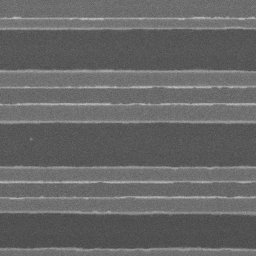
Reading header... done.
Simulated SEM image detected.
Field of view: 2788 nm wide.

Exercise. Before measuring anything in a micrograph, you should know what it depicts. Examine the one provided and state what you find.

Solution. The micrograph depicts lines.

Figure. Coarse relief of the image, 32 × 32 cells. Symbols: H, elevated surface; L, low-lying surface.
HHHHHHHHHHHHHHHHHHHHHHHHHHHHHHHH
HHHHHHHHHHHHHHHHHHHHHHHHHHHHHHHH
HHHHHHHHHHHHHHHHHHHHHHHHHHHHHHHH
HHHHHHHHHHHHHHHHHHHHHHHHHHHHHLHH
LLLLLLLLLLLLLLLLLLLLLLLLLLLLLLLL
LLLLLLLLLLLLLLLLLLLLLLLLLLLLLLLL
LLLLLLLLLLLLLLLLLLLLLLLLLLLLLLLL
LLLLLLLLLLLLLLLLLLLLLLLLLLLLLLLL
LLLLLLLLLLLLLLLLLLLLLLLLLLLLLLLL
HHHHHHHHHHHHHHHHHHHHHHHHHHHHHHHH
HHHHHHHHHHHHHHHHHHHHHHHHHHHHHHHH
HHHHHHHHHHHHHHHHHHHHHHHHHHHHHHHH
HHHHHHHHHHHHHHHHHHHHHHHHHHHHHHHH
HHHHHHHHHHHHHHHHHHHHHHHHHHHHHHHH
HHHHHHHHHHHHHHHHHHHHHHHHHHHHHHHH
LLLLLLLLLLLLLLLLLLLLLLLLLLLLLLLL
LLLLLLLLLLLLLLLLLLLLLLLLLLLLLLLL
LLLLLLLLLLLLLLLLLLLLLLLLLLLLLLLL
LLLLLLLLLLLLLLLLLLLLLLLLLLLLLLLL
LLLLLLLLLLLLLLLLLLLLLLLLLLLLLLLL
LLLLLLLLLLLLLLLLLLLLLLLLLLLLLLLL
HHHHHHHHHHHHHHHHHHHHHHHHHHHHHHHH
HHHHHHHHHHHHHHHHHHHHHHHHHHHHHHHH
HHHHHHHHHHHHHHHHHHHHHHHHHHHHHHHH
HHHHHHHHHHHHHHHHHHHHHHHHHHHHHHHH
HHHHHHHHHHHHHHHHHHHHHHHHHHHHHHHH
LLLHHLLHHHHHHHHHHHHHHHHHHHHHHHHH
LLLLLLLLLLLLLLLLLLLLLLLLLLLLLLLL
LLLLLLLLLLLLLLLLLLLLLLLLLLLLLLLL
LLLLLLLLLLLLLLLLLLLLLLLLLLLLLLLL
LLLLLLLLLLLLLLLLLLLLLLLLLLLLLLLL
HHHHHHHHHHHHHHHHHHHHHHHHHHHHHHHH